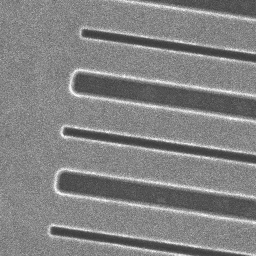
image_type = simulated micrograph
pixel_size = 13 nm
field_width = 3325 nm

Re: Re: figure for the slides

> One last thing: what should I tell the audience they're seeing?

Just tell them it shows parallel lines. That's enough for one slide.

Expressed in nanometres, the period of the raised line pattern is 660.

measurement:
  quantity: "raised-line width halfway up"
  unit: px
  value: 36.1